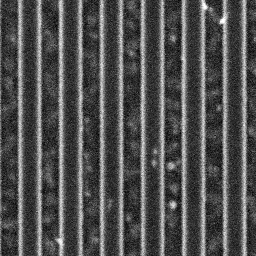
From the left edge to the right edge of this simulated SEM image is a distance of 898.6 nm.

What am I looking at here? parallel lines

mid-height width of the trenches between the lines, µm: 0.0689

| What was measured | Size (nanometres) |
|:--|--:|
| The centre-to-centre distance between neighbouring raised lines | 144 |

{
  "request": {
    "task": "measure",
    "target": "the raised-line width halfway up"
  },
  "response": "75.5 nanometers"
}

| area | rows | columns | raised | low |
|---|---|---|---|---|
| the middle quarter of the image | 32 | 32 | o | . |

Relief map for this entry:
oooo.....ooooo.....oooooo.....oo
oooo.....ooooo.....oooooo.....oo
oooo.....ooooo.....oooooo.....oo
oooo.....ooooo.....oooooo.....oo
oooo.....ooooo.....oooooo.....oo
oooo.....ooooo.....oooooo.....oo
oooo.....ooooo.....oooooo.....oo
oooo.....ooooo.....oooooo.....oo
oooo.....oooooo....oooooo.....oo
oooo.....oooooo....oooooo.....oo
oooo.....oooooo....oooooo.....oo
oooo.....oooooo....oooooo.....oo
oooo.....oooooo....oooooo.....oo
oooo.....oooooo....oooooo.....oo
oooo.....oooooo....oooooo.....oo
ooooo....oooooo....oooooo.....oo
ooooo....oooooo....oooooo.....oo
oooo.....oooooo....oooooo.....oo
oooo.....oooooo....oooooo.....oo
oooo.....ooooo......ooooo.....oo
oooo.....oooooo.....ooooo.....oo
oooo.....oooooo.....ooooo.....oo
oooo.....oooooo.....ooooo.....oo
oooo.....oooooo.....ooooo.....oo
oooo.....oooooo.....ooooo.....oo
oooo.....oooooo.....ooooo.o...oo
oooo.....oooooo.....ooooo.....oo
oooo.....ooooo......ooooo.....oo
oooo.....ooooo......ooooo.....oo
oooo.....oooooo.....ooooo.....oo
oooo.....oooooo.....ooooo.....oo
oooo.....oooooo.....ooooo.....oo